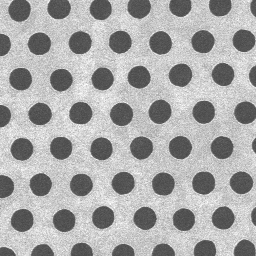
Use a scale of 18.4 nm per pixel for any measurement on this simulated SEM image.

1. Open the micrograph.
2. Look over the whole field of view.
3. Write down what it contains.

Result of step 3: a regular array of holes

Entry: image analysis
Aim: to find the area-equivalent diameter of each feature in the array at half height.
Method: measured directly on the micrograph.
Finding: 0.423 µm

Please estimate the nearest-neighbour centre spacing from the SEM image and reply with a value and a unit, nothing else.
720 nm